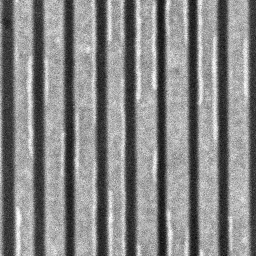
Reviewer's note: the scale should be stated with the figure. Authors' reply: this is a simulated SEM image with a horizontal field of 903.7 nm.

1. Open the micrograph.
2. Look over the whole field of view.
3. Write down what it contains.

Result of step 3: parallel lines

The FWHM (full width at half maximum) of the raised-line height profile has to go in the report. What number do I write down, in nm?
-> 74.2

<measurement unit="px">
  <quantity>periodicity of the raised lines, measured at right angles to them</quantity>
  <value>30.7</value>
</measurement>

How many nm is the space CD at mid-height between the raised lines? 35.3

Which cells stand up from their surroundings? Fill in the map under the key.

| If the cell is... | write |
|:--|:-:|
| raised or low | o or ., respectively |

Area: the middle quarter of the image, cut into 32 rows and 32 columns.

...ooooo...oooo...ooooo..oooooo.
..oooooo...oooo...ooooo..oooooo.
..oooooo...oooo...ooooo..oooooo.
..oooooo...oooo...ooooo..oooooo.
..oooooo...oooo...ooooo..oooooo.
..oooooo...oooo...ooooo..oooooo.
..oooooo...oooo...ooooo..oooooo.
..oooooo...oooo...ooooo..oooooo.
..oooooo...oooo...ooooo..oooooo.
..oooooo...oooo...ooooo..oooooo.
...ooooo...oooo...ooooo..oooooo.
...ooooo...oooo...ooooo..oooooo.
...ooooo...oooo...ooooo..oooooo.
...ooooo...oooo...ooooo...ooooo.
...ooooo...oooo...ooooo...ooooo.
...ooooo...oooo...ooooo...ooooo.
...ooooo...oooo...ooooo...ooooo.
...ooooo...oooo...ooooo...ooooo.
...ooooo...oooo...ooooo...ooooo.
...ooooo...oooo...ooooo...ooooo.
...ooooo...oooo...ooooo...ooooo.
...ooooo...oooo...ooooo...ooooo.
...ooooo...oooo...ooooo...ooooo.
...ooooo...oooo...ooooo...ooooo.
...ooooo...oooo...ooooo...ooooo.
...ooooo...oooo...ooooo...ooooo.
...ooooo...oooo...ooooo...ooooo.
...ooooo...oooo...ooooo...ooooo.
...ooooo...oooo...ooooo...ooooo.
...ooooo...oooo...ooooo...ooooo.
...ooooo...oooo...ooooo...ooooo.
...ooooo...oooo...ooooo...ooooo.